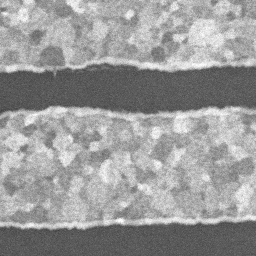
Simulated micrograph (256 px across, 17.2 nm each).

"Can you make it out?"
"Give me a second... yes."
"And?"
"one or a few lines or trenches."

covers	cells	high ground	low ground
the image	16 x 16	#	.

################
################
################
################
................
................
................
################
################
################
################
################
################
################
................
................